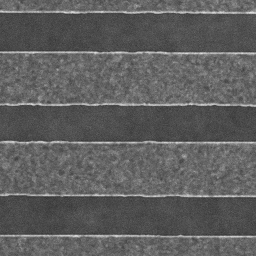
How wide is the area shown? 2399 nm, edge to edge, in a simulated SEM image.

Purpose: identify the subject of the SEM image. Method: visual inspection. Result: lines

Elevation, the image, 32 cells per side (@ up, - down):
@@@@@@@@@@@@@@@@@@@@@@@@@@@@@@@@
@@@@@@@@@@@@@@@@@@@@@@@@@@@@@@@@
--------------------------------
--------------------------------
--------------------------------
--------------------------------
--------------------------------
@@@@@@@@@@@@@@@@@@@@@@@@@@@@@@@@
@@@@@@@@@@@@@@@@@@@@@@@@@@@@@@@@
@@@@@@@@@@@@@@@@@@@@@@@@@@@@@@@@
@@@@@@@@@@@@@@@@@@@@@@@@@@@@@@@@
@@@@@@@@@@@@@@@@@@@@@@@@@@@@@@@@
@@@@@@@@@@@@@@@@@@@@@@@@@@@@@@@@
--------------------------------
--------------------------------
--------------------------------
--------------------------------
--------------------------------
@@@@@@@@@@@@@@@@@@@@@@@@@@@@@@@@
@@@@@@@@@@@@@@@@@@@@@@@@@@@@@@@@
@@@@@@@@@@@@@@@@@@@@@@@@@@@@@@@@
@@@@@@@@@@@@@@@@@@@@@@@@@@@@@@@@
@@@@@@@@@@@@@@@@@@@@@@@@@@@@@@@@
@@@@@@@@@@@@@@@@@@@@@@@@@@@@@@@@
------------------@@@-@@@@@@@@@@
--------------------------------
--------------------------------
--------------------------------
--------------------------------
@@@@@@@@@@@@@@@@@---------------
@@@@@@@@@@@@@@@@@@@@@@@@@@@@@@@@
@@@@@@@@@@@@@@@@@@@@@@@@@@@@@@@@